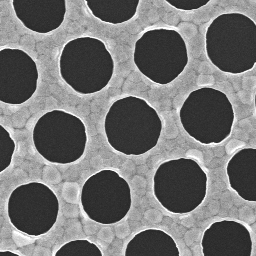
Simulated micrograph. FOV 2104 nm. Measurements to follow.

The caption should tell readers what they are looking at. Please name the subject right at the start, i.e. a regular array of holes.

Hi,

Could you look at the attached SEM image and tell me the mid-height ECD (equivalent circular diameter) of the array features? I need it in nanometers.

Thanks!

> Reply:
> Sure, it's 447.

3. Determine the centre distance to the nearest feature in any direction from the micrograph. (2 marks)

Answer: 612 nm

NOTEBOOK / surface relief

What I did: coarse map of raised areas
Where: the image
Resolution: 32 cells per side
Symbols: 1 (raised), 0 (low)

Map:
11000000111000000111100000111111
11000000111000000111111111111111
11000000111110001111111111100001
11100001111111111111111111000000
11111111111111111100000111000000
11111111000001111000000111000000
00011111000000111000000111000000
00001110000000111000000111000000
00000111000000111000000111100001
00000111000000111100001111111111
00000111100001111111011111111111
00001111110011111111111100001111
00011111111111100011111000000111
11111111111111000001111000000111
11111000011110000000110000000111
11110000001110000000111000000111
01110000000110000000111000000111
00110000000110000000111110001111
00110000000111000001111111111111
00111000001111111111111111111000
01111111111111111111000001110000
11111111111100111110000001110000
11111111111000001110000000111000
11000011110000001110000000111000
10000001110000001110000000111100
10000001110000001111000001111111
10000001111000001111100011111111
10000001111100011111111111111111
11000011111111111111111111000001
11111111111111111000011110000001
11111111000011110000001110000001
01111110000001110000001110000001